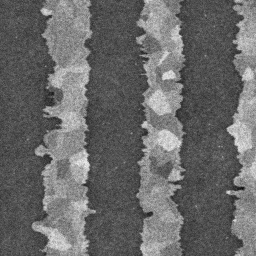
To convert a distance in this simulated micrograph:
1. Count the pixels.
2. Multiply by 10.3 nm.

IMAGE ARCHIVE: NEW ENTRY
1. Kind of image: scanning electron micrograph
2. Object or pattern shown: one or a few lines or trenches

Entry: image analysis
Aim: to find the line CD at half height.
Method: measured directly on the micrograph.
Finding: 364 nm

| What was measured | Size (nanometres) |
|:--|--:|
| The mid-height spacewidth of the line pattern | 620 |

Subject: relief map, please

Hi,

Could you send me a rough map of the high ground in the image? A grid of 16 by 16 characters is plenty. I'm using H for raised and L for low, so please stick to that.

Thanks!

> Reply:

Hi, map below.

LLLHHLLLLHHLLLLH
LLLHHHLLLHHLLLLH
LLLHHLLLLHHLLLLH
LLLHHLLLLHHLLLLH
LLLHHLLLLHHLLLLH
LLLHHLLLLHHLLLLH
LLLHHLLLLHHLLLLH
LLLLHLLLLHHLLLLH
LLLHHLLLLHHLLLLH
LLLHHLLLLHHLLLLH
LLLHHLLLLHHLLLLH
LLLHHLLLLHHLLLLH
LLLHHLLLLHHLLLLH
LLLHHLLLLHHLLLLH
LLLHHLLLLHHLLLLH
LLLHHLLLLHHLLLLH